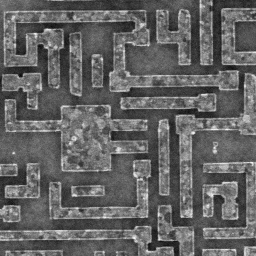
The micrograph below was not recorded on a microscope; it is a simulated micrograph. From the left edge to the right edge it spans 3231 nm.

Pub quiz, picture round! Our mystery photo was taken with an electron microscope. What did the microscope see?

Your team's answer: wiring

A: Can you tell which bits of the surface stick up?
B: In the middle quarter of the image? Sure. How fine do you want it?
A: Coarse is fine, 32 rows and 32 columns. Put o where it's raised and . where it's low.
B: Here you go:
..oo...ooo...oo.................
..oo...ooo...oo.................
..oo...ooo.ooooo................
..oo...ooo.ooooooooooooooooooooo
..oo...ooo..oooooooooooooooooooo
..oo...ooo..oooooooooooooooooo..
..oo........oooo................
..oo............................
...............ooooooooooooooooo
..............oooooooooooooooooo
...oooooooo...oooooooooooooooooo
ooooooooooo.....................
ooooooooooo.....................
oooooooooooo................oooo
ooooooooooooooooooooo...oo..oooo
ooooooooooooooooooooo...oo..oooo
oooooooooooooooooo......oo..oooo
oooooooooooo............oo..oooo
oooooooooooo............oo...ooo
ooooooooooooooooooooo...oo...ooo
ooooooooooooooooooooo...oo...ooo
ooooooooooooooooooooo...oo...ooo
oooooooooooo............oo...ooo
oooooooooooo............oo...ooo
oooooooooooo......oooo..oo...ooo
oooooooooooo......oooo..oo...ooo
ooooooooooo.......oooo..oo...ooo
..................oooo..oo...ooo
..................ooo...oo...ooo
...................oo...oo...ooo
...................oo...oo...ooo
..oooooooo.........oo...oo...ooo